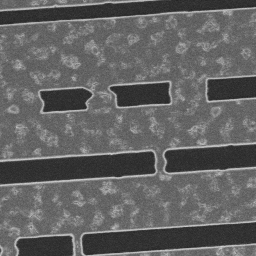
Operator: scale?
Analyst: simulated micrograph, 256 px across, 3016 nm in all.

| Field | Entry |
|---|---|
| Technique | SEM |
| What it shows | one or a few lines or trenches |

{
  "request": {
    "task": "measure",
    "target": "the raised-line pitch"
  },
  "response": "900 nm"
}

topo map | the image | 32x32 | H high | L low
HHHHHHHHHHHHLLLLLLLLLLLLLLLLLLLL
LLLLLLLLLLLLLLLLLLLLLLLLLHHHHHHH
LLLLLLLLLLHHHHHHHHHHHHHHHHHHHHHH
HHHHHHHHHHHHHHHHHHHHHHHHHHHHHHHH
HHHHHHHHHHHHHHHHHHHHHHHHHHHHHHHH
HHHHHHHHHHHHHHHHHHHHHHHHHHHHHHHH
HHHHHHHHHHHHHHHHHHHHHHHHHHHHHHHH
HHHHHHHHHHHHHHHHHHHHHHHHHHHHHHHH
HHHHHHHHHHHHHHHHHHHHHHHHHHHHHHHH
HHHHHHHHHHHHHHHHHHHHHHHHHHHHHHHL
HHHHHHHHHHHHHHHHHLLLLHHHHHLLLLLL
HHHHHLLLLLLHHHLLLLLLLHHHHHLLLLLL
HHHHHLLLLLLHHHHLLLLLLHHHHHLLLHHH
HHHHHLLLLLLHHHHHHHHHHHHHHHHHHHHH
HHHHHHHHHHHHHHHHHHHHHHHHHHHHHHHH
HHHHHHHHHHHHHHHHHHHHHHHHHHHHHHHH
HHHHHHHHHHHHHHHHHHHHHHHHHHHHHHHH
HHHHHHHHHHHHHHHHHHHHHHHHHHHHHHHH
HHHHHHHHHHHHHHHHHHHHHHLLLLLLLLLL
HHHHHHHHLLLLLLLLLLLHHLLLLLLLLLLL
LLLLLLLLLLLLLLLLLLLHHLLLLLLLLLLL
LLLLLLLLLLLLLLLLLLLHHLLLHHHHHHHH
LLLLLLLLLHHHHHHHHHHHHHHHHHHHHHHH
HHHHHHHHHHHHHHHHHHHHHHHHHHHHHHHH
HHHHHHHHHHHHHHHHHHHHHHHHHHHHHHHH
HHHHHHHHHHHHHHHHHHHHHHHHHHHHHHHH
HHHHHHHHHHHHHHHHHHHHHHHHHHHHHHHH
HHHHHHHHHHHHHHHHHHHHHHHHHHHHHHHH
HHHHHHHHHHHHHHHHHHHHLLLLLLLLLLLL
HHHHHHLLLHLLLLLLLLLLLLLLLLLLLLLL
HHLLLLLLLHLLLLLLLLLLLLLLLLLLLLLL
HHLLLLLLLHLLLLLLLLHHHHHHHHHHHHHH